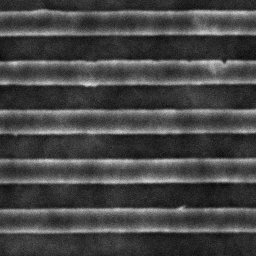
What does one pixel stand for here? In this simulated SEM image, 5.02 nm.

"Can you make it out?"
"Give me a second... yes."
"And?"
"parallel lines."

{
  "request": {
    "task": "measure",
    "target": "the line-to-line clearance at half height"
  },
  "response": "129 nanometers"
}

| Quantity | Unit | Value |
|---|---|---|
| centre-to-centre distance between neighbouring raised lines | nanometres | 248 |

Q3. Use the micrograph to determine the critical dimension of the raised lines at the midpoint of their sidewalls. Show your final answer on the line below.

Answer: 119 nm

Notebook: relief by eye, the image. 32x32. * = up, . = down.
................................
....****....********************
********************************
********************************
................................
................................
................................
................................
********************************
********************************
...********************.........
................................
................................
................................
********************************
********************************
********************************
................................
................................
................................
********************************
********************************
********************************
................................
................................
................................
********************************
********************************
********************************
................................
................................
................................